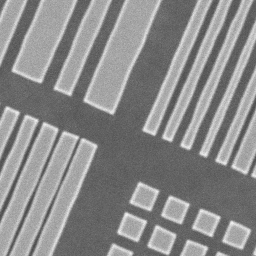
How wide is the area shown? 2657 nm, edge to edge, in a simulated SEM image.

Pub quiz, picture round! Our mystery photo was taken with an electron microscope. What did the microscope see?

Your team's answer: groups of lines, slits or small figures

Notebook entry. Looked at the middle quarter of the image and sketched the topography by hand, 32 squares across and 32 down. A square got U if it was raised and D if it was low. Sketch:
UUUUUDDDDUUUUUUUUDDDDDDDDDDUUUDD
UUUUDDDDUUUUUUUUUDDDDDDDDDUUUUDD
UUUUDDDDUUUUUUUUDDDDDDDDDDUUUDDD
UUUUDDDUUUUUUUUUDDDDDDDDDDUUUDDU
UUUDDDDUUUUUUUUUDDDDDDDDDUUUDDDU
UUUDDDUUUUUUUUUDDDDDDDDDDUUUDDUU
UUDDDDUUUUUUUUUDDDDDDDDDUUUUDDUU
UUDDDDUUUUUUUUDDDDDDDDDDUUUDDUUU
DDDDDUUUUUUUUUDDDDDDDDDUUUUDDUUU
DDDDDUUUUUUUUUDDDDDDDDDUUUDDUUUD
DDDDDDDUUUUUUDDDDDDDDDDUUUDDUUUD
DDDDDDDDDDUUUDDDDDDDDDUUUDDDUUUD
DDDDDDDDDDDDDDDDDDDDDDUUUDDUUUDD
DDDDDDDDDDDDDDDDDDDDDUUUUDDUUUDD
DDDDDDDDDDDDDDDDDDDDDUUUDDUUUDDD
DDDDDDDDDDDDDDDDDDDDUUUUDDUUUDDD
DDDDDDDDDDDDDDDDDDDDUUUDDUUUDDDU
UUDDDDDDDDDDDDDDDDDDDDUDDUUUDDUU
UUUDDDDDDDDDDDDDDDDDDDDDDUUDDDUU
UUUDUUUDDDDDDDDDDDDDDDDDDDDDDDUU
UUUDUUUUDDDDDDDDDDDDDDDDDDDDDDUU
UUDUUUUUDDDDDDDDDDDDDDDDDDDDDDDD
UUDUUUUDDDDDDDDDDDDDDDDDDDDDDDDD
UDUUUUUDDDDDDDDDDDDDDDDDDDDDDDDD
UDUUUUUDDDDDDDDDDDDDDDDDDDDDDDDD
UUUUUUDDDDDDDDDDDDDDDDDDDDDDDDDD
DUUUUUDDDDDDDDDDDDDDDDDDDDDDDDDD
DUUUUDDDDDDDDDDDDDDDDDDDDDDDDDDD
UUUUUDDDDDDDDDDDDDDDDDDDDDDDDDDD
UUUUUDDDDDDDDDDDDDDDDDDDDDDDDDDD
UUUUDDDDDDDDDDDDDDUUUDDDDDDDDDDD
UUUUDDDDDDDDDDDDDDUUUUUDDDDDDDDD